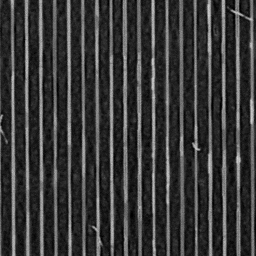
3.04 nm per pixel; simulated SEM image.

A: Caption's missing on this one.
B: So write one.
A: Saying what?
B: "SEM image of parallel lines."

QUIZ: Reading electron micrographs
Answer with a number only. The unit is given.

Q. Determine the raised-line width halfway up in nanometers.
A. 8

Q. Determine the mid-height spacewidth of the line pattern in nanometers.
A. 34.6